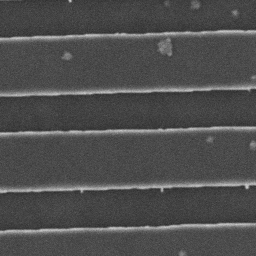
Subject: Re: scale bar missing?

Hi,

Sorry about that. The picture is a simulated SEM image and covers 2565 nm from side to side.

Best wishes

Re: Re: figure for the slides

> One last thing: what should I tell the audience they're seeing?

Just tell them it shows lines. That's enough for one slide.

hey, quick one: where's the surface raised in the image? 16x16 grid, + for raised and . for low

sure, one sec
................
................
++++++++++++++++
++++++++++++++++
++++++++++++++++
++++++++++++++++
................
................
++++++++++++++++
++++++++++++++++
++++++++++++++++
++++++++++++++++
................
................
++++++++++++++++
++++++++++++++++